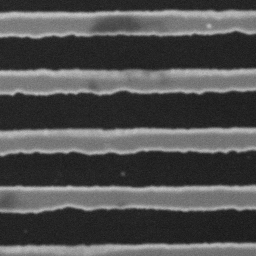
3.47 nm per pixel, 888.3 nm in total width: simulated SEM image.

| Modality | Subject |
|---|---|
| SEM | lines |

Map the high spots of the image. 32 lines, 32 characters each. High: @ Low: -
--------------------------------
--------------------------------
@@@@@@@@@@@@@@@@@@@@@@@@@@@@@@@@
@@@@@@@@@@@@@@@@@@@@@@@@@@@@@@@@
@-@@@@--------------------------
--------------------------------
--------------------------------
--------------------------------
--------------------------------
@@@@@@@@@@@@@@@@@@@@@@@@@@@@@@@@
@@@@@@@@@@@@@@@@@@@@@@@@@@@@@@@@
@@@@@@@@@@@@@@@-@@@@@--@@@------
--------------------------------
--------------------------------
--------------------------------
--------------------------------
--@@@@@@@@@@@-@@@@@@@@@@@@@@@@@@
@@@@@@@@@@@@@@@@@@@@@@@@@@@@@@@@
@@@@@@@@@@@@@@@@@@@@@@@@@@@@@@@@
--------------------------------
--------------------------------
--------------------------------
--------------------------------
@@@---@-@@-@@@@--------@@@@@@@@@
@@@@@@@@@@@@@@@@@@@@@@@@@@@@@@@@
@@@@@@@@@@@@@@@@@@@@@@@@@@@@@@@@
-@@@@---------------------------
--------------------------------
--------------------------------
--------------------------------
----------------------------@---
@@@@@@@@@@@@@@@@@@@@@@@@@@@@@@@@